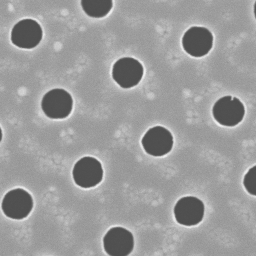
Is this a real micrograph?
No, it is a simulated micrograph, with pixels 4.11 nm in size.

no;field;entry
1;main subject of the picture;a regular array of holes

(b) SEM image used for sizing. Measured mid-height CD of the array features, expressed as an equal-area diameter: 0.123 um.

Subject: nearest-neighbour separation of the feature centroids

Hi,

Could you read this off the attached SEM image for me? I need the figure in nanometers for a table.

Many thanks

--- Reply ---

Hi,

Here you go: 312